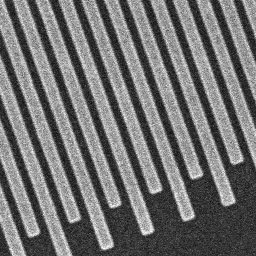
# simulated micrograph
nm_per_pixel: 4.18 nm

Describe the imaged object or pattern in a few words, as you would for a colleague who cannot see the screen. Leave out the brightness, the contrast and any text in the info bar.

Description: parallel lines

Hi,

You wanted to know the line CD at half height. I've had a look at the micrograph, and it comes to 0.0492 micrometres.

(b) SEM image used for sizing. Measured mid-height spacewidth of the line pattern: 0.0423 um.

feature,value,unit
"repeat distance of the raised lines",90.2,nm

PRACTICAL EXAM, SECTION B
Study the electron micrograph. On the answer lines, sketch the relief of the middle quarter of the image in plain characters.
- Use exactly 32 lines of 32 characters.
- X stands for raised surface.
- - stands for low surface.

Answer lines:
XX---XXX--XXXX--XXX---XXX---XXX-
XX---XXX---XXX---XX---XXX---XXX-
XXX---XX---XXX---XXX---XXX--XXX-
XXX---XXX--XXXX--XXX---XXX---XXX
XXXX--XXX---XXX--XXXX--XXX---XXX
-XXX---XX---XXX---XXX---XXX--XXX
-XXX---XXX---XXX--XXX---XXX---XX
-XXXX--XXX---XXX---XXX--XXX---XX
--XXX---XXX--XXX---XXX---XXX--XX
--XXX---XXX---XXX--XXX---XXX---X
---XXX--XXX---XXX---XXX--XXXX--X
---XXX--XXXX--XXX---XXX---XXX--X
X--XXX---XXX---XXX--XXX---XXX---
X--XXXX--XXX---XXX---XXX--XXXX--
X---XXX---XXX--XXXX--XXX---XXX--
XX--XXX---XXX---XXX---XX---XXX--
XX---XXX--XXX---XXX---XXX---XXX-
XX---XXX---XXX--XXXX--XXX---XXX-
XXX--XXXX--XXX---XXX---XXX--XXX-
XXX---XXX--XXX---XXX---XXX---XXX
XXX---XXX---XXX---XXX--XXX---XXX
-XXX--XXX---XXX---XXX---XXX--XXX
-XXX---XXX--XXXX--XXX---XXX---XX
-XXX---XXX---XXX---XXX--XXX---XX
--XXX---XXX--XXX---XXX---XXX--XX
--XXX---XXX---XXX--XXX---XXX---X
--XXXX--XXX---XXX---XXX--XXX---X
---XXX---XXX--XXX---XXX---XXX--X
---XXX---XXX---XXX--XXXX--XXX---
X--XXXX--XXX---XXX---XXX--XXXX--
X---XXX---XXX--XXX---XXX---XXX--
X---XXX---XXX---XXX--XXX---XXX--